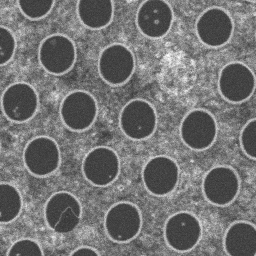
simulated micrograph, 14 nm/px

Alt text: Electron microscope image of a regular array of raised bodies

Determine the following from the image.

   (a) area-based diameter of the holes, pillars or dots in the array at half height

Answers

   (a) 547 nm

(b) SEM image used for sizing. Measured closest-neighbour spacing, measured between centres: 59.5 px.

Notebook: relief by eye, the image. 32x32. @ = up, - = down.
--@@@@@---@@@@----@@@-----------
---@@@----@@@@---@@@@@----@@----
----------@@@@---@@@@@---@@@@---
@----------@@----@@@@---@@@@@---
@@----@@----------@@-----@@@@---
@@---@@@@-----@-----------@@----
@@---@@@@----@@@----------------
@----@@@@---@@@@@---------------
------@@@---@@@@@-----------@@@-
-------------@@@-----------@@@@@
--@-----------@------------@@@@@
-@@@-----@@-----------------@@@@
@@@@@---@@@@-----@----------@@@-
@@@@@---@@@@---@@@@-------------
-@@@----@@@@---@@@@----@@@------
--------@@@----@@@@@---@@@@----@
---------------@@@@----@@@@---@@
----@@@----------------@@@@---@@
---@@@@-----@@----------@@----@@
---@@@@----@@@@-----@----------@
---@@@@---@@@@@---@@@@----------
----@@@---@@@@@---@@@@----@@@---
-----------@@@----@@@@---@@@@@--
@@----------------@@@@---@@@@@--
@@@----@@-----------------@@@@--
@@@---@@@@-----@-----------@@---
@@@---@@-@---@@@@---------------
@@----@------@@@@@---@@@@-------
------@------@@@@@---@@@@----@@@
--------------@@@----@@@@---@@@@
--@@@----------------@@@@---@@@@
-@@@@----@@@----------------@@@@